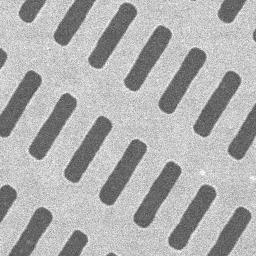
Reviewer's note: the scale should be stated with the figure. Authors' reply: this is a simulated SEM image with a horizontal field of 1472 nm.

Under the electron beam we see a regular array of holes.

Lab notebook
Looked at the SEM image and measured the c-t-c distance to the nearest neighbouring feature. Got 0.238 microns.